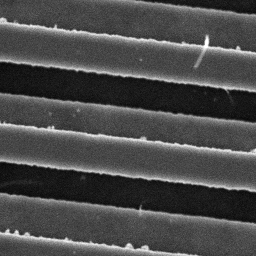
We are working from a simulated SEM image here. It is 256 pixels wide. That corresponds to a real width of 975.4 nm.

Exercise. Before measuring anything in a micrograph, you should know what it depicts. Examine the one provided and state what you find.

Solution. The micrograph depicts lines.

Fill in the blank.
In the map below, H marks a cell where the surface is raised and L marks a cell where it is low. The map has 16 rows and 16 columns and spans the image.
HHHHHHHHHHHHLLLL
HHHHHHHHHHHHHHHH
HHHHHHHHHHHHHHHH
HHHHHHHHHHHHHHHH
LLLLLLHHHHHHHHHH
LLLLLLLLLLLLLLHH
HHHHHHLLLLLLLLLL
HHHHHHHHHHHHHHLL
HHHHHHHHHHHHHHHH
HHHHHHHHHHHHHHHH
LLLHHHHHHHHHHHHH
LLLLLLLLLLLLHHHH
HHHHLLLLLLLLLLLL
HHHHHHHHHHHHLLLL
HHHHHHHHHHHHHHHH
HHHHHHHHHHHHHHHH